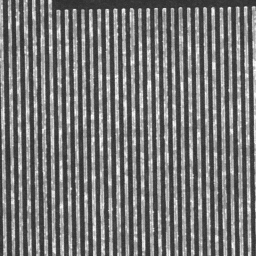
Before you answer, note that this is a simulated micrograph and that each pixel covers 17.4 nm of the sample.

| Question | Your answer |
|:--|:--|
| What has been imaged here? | parallel lines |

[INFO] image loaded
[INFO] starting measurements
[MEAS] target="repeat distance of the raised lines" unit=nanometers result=142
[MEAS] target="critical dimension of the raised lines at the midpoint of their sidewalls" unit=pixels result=3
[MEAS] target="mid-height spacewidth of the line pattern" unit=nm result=84.8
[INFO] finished